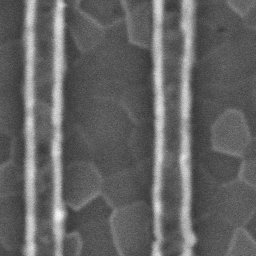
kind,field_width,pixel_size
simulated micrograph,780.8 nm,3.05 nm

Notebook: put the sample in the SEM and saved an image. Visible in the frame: one or a few lines or trenches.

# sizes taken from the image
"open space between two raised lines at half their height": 297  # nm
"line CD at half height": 0.0935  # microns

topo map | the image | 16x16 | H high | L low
LLHHLLLLLLHHLLLL
LLHHLLLLLLHHLLLL
LLHHLLLLLLHHLLLL
LLHHLLLLLLHHLLLL
LLHHLLLLLLHHLLLL
LLHHLLLLLLHHLLLL
LLHHLLLLLLHHLLLL
LLHHLLLLLLHHLLLL
LLHHLLLLLLHHLLLL
LLHHLLLLLLHHLLLL
LLHHLLLLLLHHLLLL
LLHHLLLLLLHHLLLL
LLHHLLLLLLHHLLLL
LLHHLLLLLLHHLLLL
LLHHLLLLLLHHLLLL
LLHHLLLLLLHHLLLL